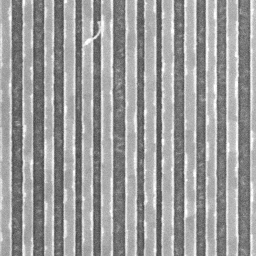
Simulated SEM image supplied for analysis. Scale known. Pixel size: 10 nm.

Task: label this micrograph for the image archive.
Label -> parallel lines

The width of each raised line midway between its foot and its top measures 103 nanometers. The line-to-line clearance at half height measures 112 nanometers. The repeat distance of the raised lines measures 206 nm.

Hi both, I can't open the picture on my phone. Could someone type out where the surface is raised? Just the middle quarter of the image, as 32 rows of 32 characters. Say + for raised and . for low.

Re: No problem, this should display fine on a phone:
+++..++...++....++..+++..++...++
+++..++...++....++..+++..++...++
+++..++...++....++..+++..++...++
+++..++..+++....++..+++..++...++
+++..++..+++....++..+++..++...++
+++..++...++...+++..+++..++...++
+++..++..+++....++..+++..++...++
+++..++...++....++..+++..++...++
+++..++...++....++..+++..++...++
+++..++...++....++..+++..++...++
+++..++...++....++..+++..++...++
+++..++...++....++..+++..++...++
+++..++...++....++..+++..++...++
+++..++...++....++..+++..++...++
+++..++...++....++..+++..++...++
+++..++...++....++..+++..++...++
+++..++...++....++..+++..++...++
+++..++...++....++..+++..++...++
+++..++..+++....++..+++..++...++
+++..++..+++....++..+++..++...++
+++..++..+++....++..+++..++...++
+++..++...++....++..+++..++...++
+++..++...++....++..+++..++...++
+++..++...++....++..+++..++...++
+++..++...++....++..+++..++...++
+++..++..+++....++..+++..++...++
+++..++..+++....++..+++..++...++
+++..++..+++....++..+++..++...++
+++..++..+++....++..+++..++...++
+++..++..+++....++..+++..++...++
+++..++..+++....++..+++..++...++
+++..++...++....++..+++..++...++